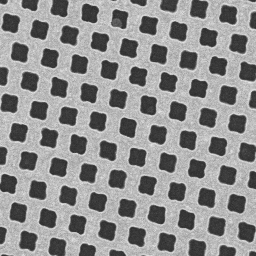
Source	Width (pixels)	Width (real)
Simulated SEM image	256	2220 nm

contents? a regular array of holes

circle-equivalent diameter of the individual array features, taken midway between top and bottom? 18.8 pixels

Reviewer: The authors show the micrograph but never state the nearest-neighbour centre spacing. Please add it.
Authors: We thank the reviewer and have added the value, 259 nm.